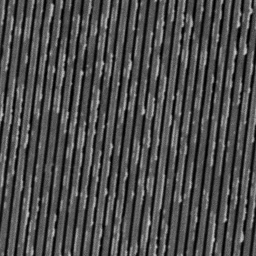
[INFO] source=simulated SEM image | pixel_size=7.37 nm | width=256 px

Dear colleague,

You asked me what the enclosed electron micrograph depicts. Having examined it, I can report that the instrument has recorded parallel lines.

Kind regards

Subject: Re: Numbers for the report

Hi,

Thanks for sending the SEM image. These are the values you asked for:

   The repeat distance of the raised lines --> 69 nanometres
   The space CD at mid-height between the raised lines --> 28.3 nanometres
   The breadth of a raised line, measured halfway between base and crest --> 43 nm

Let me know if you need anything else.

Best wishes